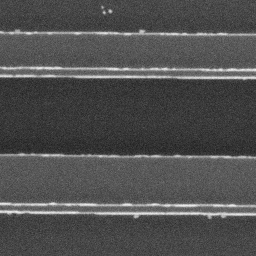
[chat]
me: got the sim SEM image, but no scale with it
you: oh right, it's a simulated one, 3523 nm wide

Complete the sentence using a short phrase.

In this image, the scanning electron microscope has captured lines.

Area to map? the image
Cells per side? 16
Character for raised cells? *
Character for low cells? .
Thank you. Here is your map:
................
................
****************
****************
****************
................
................
................
................
................
****************
****************
****************
................
................
................